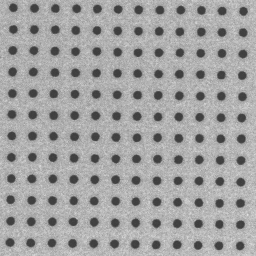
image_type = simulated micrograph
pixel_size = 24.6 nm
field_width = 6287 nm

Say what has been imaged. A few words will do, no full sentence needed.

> a regular array of holes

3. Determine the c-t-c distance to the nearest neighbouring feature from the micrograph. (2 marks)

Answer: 510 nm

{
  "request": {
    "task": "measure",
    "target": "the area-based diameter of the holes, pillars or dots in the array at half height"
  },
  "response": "222 nm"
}